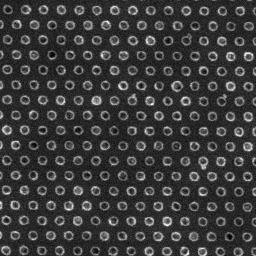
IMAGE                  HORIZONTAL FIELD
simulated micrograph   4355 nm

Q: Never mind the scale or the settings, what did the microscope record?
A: a regular array of raised bodies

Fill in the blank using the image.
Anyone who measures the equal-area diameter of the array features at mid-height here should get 0.149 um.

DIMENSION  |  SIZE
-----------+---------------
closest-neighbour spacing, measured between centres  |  0.293 um